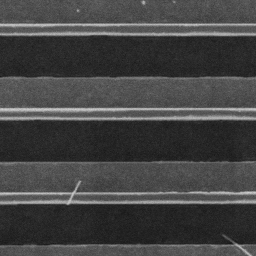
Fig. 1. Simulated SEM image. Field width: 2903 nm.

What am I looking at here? lines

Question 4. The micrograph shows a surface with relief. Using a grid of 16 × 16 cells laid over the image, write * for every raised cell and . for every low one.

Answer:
****************
****************
................
................
................
****************
****************
................
................
................
****************
****************
****************
................
................
****************